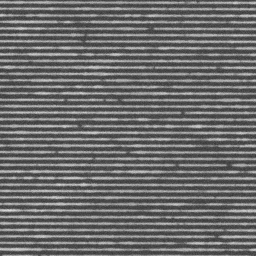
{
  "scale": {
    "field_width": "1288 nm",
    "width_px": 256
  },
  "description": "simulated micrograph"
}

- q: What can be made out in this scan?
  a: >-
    parallel lines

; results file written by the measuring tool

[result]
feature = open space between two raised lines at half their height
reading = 23.9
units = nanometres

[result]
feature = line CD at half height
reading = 8.2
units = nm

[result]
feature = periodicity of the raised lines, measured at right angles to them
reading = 32.7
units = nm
